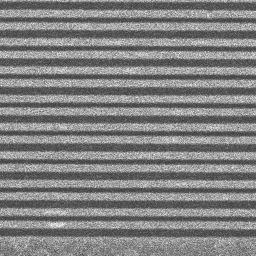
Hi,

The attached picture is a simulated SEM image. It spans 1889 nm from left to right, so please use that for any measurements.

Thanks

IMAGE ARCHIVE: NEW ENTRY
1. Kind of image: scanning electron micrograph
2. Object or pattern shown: parallel lines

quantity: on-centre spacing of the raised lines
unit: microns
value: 0.104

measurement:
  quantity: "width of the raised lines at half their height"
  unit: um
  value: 0.0553